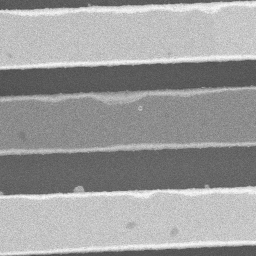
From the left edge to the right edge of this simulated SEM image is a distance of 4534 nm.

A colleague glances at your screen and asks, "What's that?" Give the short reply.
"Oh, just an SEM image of lines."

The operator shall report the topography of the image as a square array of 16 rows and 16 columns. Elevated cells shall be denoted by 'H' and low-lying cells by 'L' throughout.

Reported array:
LLLLLHHHHHHHHHHH
HHHHHHHHHHHHHHHH
HHHHHHHHHHHHHHHH
HHHHHHHHHHHHHHHH
LLLLLLLLLLLLLLLL
LLLLLLLLLLLLLLHH
HHHHHHHHHHHHHHHH
HHHHHHHHHHHHHHHH
HHHHHHHHHHHHHHHH
HHHHLLLLLLLLLLLL
LLLLLLLLLLLLLLLL
LLLLLLLLLLLLLLLL
HHHHHHHHHHHHHHHH
HHHHHHHHHHHHHHHH
HHHHHHHHHHHHHHHH
HHHHHHHHHHHLLLLL